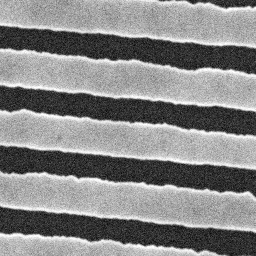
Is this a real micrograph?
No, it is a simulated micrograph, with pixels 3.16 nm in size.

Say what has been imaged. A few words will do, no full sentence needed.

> lines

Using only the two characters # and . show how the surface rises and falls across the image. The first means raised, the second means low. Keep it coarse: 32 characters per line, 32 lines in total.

##########################......
################################
################################
...#############################
...............#################
.........................#######
####............................
############.#..................
######################..........
################################
################################
........########################
...................#############
.............................###
#######.........................
###################.............
##########################......
################################
....############################
..............##################
........................########
................................
#############...................
#######################.........
################################
################################
......##########################
.................###############
...........................#####
#####...........................
#################...............
########################.#......